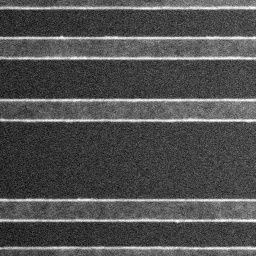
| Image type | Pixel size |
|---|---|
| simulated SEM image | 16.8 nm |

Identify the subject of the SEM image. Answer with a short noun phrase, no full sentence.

lines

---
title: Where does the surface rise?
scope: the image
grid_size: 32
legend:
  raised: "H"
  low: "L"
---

HHHHHHHHHHHHHHHHHHHHHHHHHHHHHHHH
LLLLLLLLLLLLLLLLLLLLLLLLLLLLLLLL
LLLLLLLLLLLLLLLLLLLLLLLLLLLLLLLL
LLLLLLLLLLLLLLLLLLLLLLLLLLLLLLLL
LLLLLLLLLLLLLLLLLLLLLLLLLLLLLLLL
HHHHHHHHHHHHHHHHHHHHHHHHHHHHHHHH
HHHHHHHHHHHHHHHHHHHHHHHHHHHHHHHH
LLLLLLLLLLLLLLLLLLLLLLLLLLLLLLLL
LLLLLLLLLLLLLLLLLLLLLLLLLLLLLLLL
LLLLLLLLLLLLLLLLLLLLLLLLLLLLLLLL
LLLLLLLLLLLLLLLLLLLLLLLLLLLLLLLL
LLLLLLLLLLLLLLLLLLLLLLLLLLLLLLLL
LLLLLLLLLLHHLLHHLHHHHLHHHLHHHHHH
HHHHHHHHHHHHHHHHHHHHHHHHHHHHHHHH
HHHHHHHHHHHHHHHHHHHHHHHHHHHHHHHH
LLLLLLLLLLLLLLLLLLLLLLLLLLLLLLLL
LLLLLLLLLLLLLLLLLLLLLLLLLLLLLLLL
LLLLLLLLLLLLLLLLLLLLLLLLLLLLLLLL
LLLLLLLLLLLLLLLLLLLLLLLLLLLLLLLL
LLLLLLLLLLLLLLLLLLLLLLLLLLLLLLLL
LLLLLLLLLLLLLLLLLLLLLLLLLLLLLLLL
LLLLLLLLLLLLLLLLLLLLLLLLLLLLLLLL
LLLLLLLLLLLLLLLLLLLLLLLLLLLLLLLL
LLLLLLLLLLLLLLLLLLLLLLLLLLLLLLLL
LLLLLLLLLLLLLLLLLLLLLLLLLLLLLLLL
HHHHHHHHHHHHHHHHHHHHHHHHHHHHHHHH
HHHHHHHHHHHHHHHHHHHHHHHHHHHHHHHH
HHHLLHHHHHLHHHHHHLLHHHHHHHHHLHHH
LLLLLLLLLLLLLLLLLLLLLLLLLLLLLLLL
LLLLLLLLLLLLLLLLLLLLLLLLLLLLLLLL
LLLLLLLLLLLLLLLLLLLLLLLLLLLLLLLL
HHHHHHHHHHHHHHHHHHHHHHHHHHHHHHHH